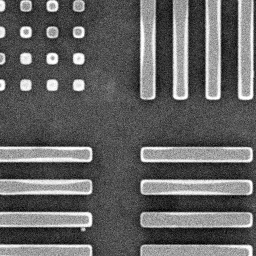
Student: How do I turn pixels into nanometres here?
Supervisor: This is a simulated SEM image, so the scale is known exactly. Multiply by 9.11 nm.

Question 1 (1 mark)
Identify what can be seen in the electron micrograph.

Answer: groups of lines, slits or small figures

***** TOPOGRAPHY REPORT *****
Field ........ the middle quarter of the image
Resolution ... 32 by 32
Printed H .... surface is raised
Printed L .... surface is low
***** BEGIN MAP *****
LLLLLLLLLLLLLLLLLLLHHHHLLLLLHHHL
LLLLLLLLLLLLLLLLLLLHHHHLLLLLHHHL
LLLLLLLLLLLLLLLLLLLHHHHLLLLLHHHL
LLLLLLLLLLLLLLLLLLLHHHHLLLLLHHHL
LLLLLLLLLLLLLLLLLLLHHHHLLLLLHHHL
LLLHHLLLLLLLLLLLLLLHHHHLLLLLHHHL
LLLLLLLLLLLLLLLLLLLHHHHLLLLLHHHL
LLLLLLLLLLLLLLLLLLLHHHHLLLLLHHHL
LLLLLLLLLLLLLLLLLLLLHHLLLLLLLLLL
LLLLLLLLLLLLLLLLLLLLLLLLLLLLLLLL
LLLLLLLLLLLLLLLLLLLLLLLLLLLLLLLL
LLLLLLLLLLLLLLLLLLLLLLLLLLLLLLLL
LLLLLLLLLLLLLLLLLLLLLLLLLLLLLLLL
LLLLLLLLLLLLLLLLLLLLLLLLLLLLLLLL
LLLLLLLLLLLLLLLLLLLLLLLLLLLLLLLL
LLLLLLLLLLLLLLLLLLLLLLLLLLLLLLLL
LLLLLLLLLLLLLLLLLLLLLLLLLLLLLLLL
LLLLLLLLLLLLLLLLLLLLLLLLLLLLLLLL
LLLLLLLLLLLLLLLLLLLLLLLLLLLLLLLL
LLLLLLLLLLLLLLLLLLLLLLLLLLLLLLLL
LLLLLLLLLLLLLLLLLLLLLLLLLLLLLLLL
HHHHHHHLLLLLLLLLLLLLHHHHHHHHHHHH
HHHHHHHLLLLLLLLLLLLLHHHHHHHHHHHH
HHHHHHHLLLLLLLLLLLLLHHHHHHHHHHHH
LLLLLLLLLLLLLLLLLLLLLLLLLLLLLLLL
LLLLLLLLLLLLLLLLLLLLLLLLLLLLLLLL
LLLLLLLLLLLLLLLLLLLLLLLLLLLLLLLL
LLLLLLLLLLLLLLLLLLLLLLLLLLLLLLLL
LLLLLLLLLLLLLLLLLLLLLLLLLLLLLLLL
HHHHHHHLLLLLLLLLLLLLHHHHHHHHHHHH
HHHHHHHLLLLLLLLLLLLLHHHHHHHHHHHH
HHHHHHHLLLLLLLLLLLLHHHHHHHHHHHHH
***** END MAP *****